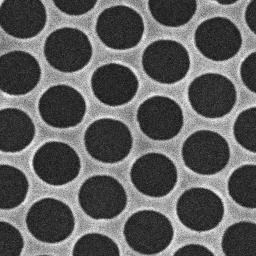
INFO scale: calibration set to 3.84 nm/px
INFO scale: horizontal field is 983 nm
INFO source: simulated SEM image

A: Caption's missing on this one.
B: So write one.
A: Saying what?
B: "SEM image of a regular array of holes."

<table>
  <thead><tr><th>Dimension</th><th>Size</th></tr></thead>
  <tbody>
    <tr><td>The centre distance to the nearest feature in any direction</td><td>56.5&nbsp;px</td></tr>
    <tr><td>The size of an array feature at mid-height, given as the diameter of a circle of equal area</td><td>0.178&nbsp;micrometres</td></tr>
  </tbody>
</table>